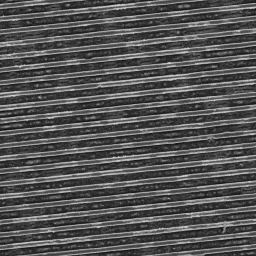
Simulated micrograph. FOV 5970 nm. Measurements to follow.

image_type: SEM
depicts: parallel lines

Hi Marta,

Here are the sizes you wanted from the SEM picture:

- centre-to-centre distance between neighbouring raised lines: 294 nm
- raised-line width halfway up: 92.8 nanometers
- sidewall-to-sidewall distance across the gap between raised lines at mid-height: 0.206 um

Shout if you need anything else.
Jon